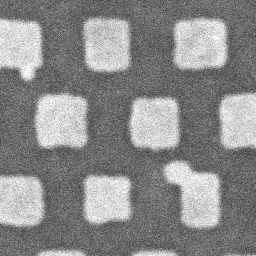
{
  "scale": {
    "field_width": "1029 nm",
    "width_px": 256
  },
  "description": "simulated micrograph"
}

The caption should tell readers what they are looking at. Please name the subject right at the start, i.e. raised bodies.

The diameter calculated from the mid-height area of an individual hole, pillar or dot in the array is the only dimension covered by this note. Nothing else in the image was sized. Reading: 212 nanometers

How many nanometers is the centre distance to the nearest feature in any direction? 358